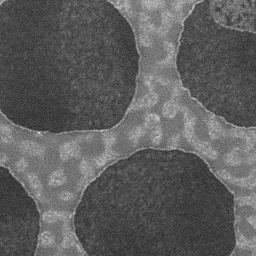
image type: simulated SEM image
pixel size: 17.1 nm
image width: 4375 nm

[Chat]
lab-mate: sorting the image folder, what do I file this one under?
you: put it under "raised bodies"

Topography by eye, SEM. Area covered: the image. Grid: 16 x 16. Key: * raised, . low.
*******.....****
********...*****
********...*****
*********..*****
*********..*****
*********...****
********....****
.*******......**
................
........****....
.......******...
*.....********..
**...**********.
***..**********.
***..**********.
**...**********.